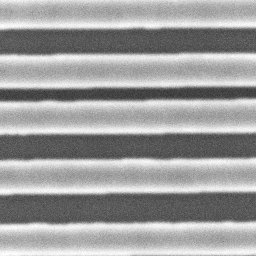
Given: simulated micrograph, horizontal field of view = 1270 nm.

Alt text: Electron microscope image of lines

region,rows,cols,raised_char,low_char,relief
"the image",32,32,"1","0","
11111111111111111111111111111111
11111111111111111111111111111111
11111111111111111111111111111111
10000000000000000000000000000000
00000000000000000000000000000000
00000000000000000000000000000000
00000000000000000000000000000000
11111111111111111111111111111111
11111111111111111111111111111111
11111111111111111111111111111111
11111111111111111111111111111111
00000000000000000000000000000000
00000000000000000000000000000111
11111111111111111111111111111111
11111111111111111111111111111111
11111111111111111111111111111111
11111111111111110111100000000000
00000000000000000000000000000000
00000000000000000000000000000000
00000000000000000000000000000000
11111111111111111111111111111111
11111111111111111111111111111111
11111111111111111111111111111111
11111111111111111111111111111111
00000000000000000000000000000000
00000000000000000000000000000000
00000000000000000000000000000000
00000000000000000000000000000000
11111111111111111111111111111111
11111111111111111111111111111111
11111111111111111111111111111111
11111111111111111111111111111111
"